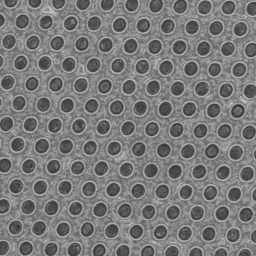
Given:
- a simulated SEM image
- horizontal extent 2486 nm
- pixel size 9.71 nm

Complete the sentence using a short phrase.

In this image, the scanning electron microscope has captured a regular array of holes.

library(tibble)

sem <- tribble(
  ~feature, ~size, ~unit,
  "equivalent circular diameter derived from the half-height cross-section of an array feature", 144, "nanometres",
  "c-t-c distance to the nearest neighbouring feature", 229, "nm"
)